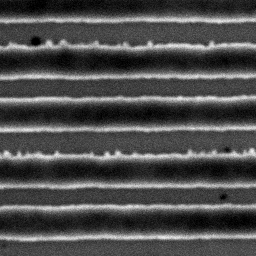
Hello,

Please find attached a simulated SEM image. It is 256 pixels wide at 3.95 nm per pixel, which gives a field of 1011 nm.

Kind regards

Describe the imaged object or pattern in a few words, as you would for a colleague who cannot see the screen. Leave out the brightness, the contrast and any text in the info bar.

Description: lines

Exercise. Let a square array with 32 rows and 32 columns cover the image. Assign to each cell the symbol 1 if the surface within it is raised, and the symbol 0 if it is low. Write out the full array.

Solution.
11111111111111111111111111111111
11111111111111111111111111111111
11111111111111111111111111111111
00000000000000000000000000000000
00000000000000000000000000000000
00000011000000000000000000000000
11111111111111111111111111111111
11111111111111111111111111111111
11111111111111111111111111111111
11111111111111111111111111111111
00000000000000000000000000000000
00000000000000000000000000000000
11111111111111111111111111111111
11111111111111111111111111111111
11111111111111111111111111111111
11111111111111111111111111111111
00000000000000000000000000000000
00000000000000000000000000000000
00000000000000000000000000000000
10011111111101111111111111111111
11111111111111111111111111111111
11111111111111111111111111111111
11111111111111111111111111111111
00000000000000000000000000000000
00000000000000000000000000000000
00000000000000000000000000000000
11111111111111111111111111111111
11111111111111111111111111111111
11111111111111111111111111111111
11111111111111111111111111111111
00000000000000000000000000000000
00000000000000000000000000000000